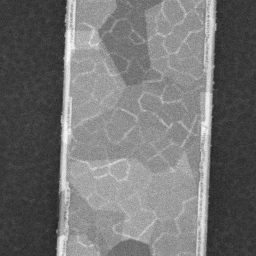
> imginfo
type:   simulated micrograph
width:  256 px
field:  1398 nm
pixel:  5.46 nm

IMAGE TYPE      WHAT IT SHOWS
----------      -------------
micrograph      one or a few lines or trenches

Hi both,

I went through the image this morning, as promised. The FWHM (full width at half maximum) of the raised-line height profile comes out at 767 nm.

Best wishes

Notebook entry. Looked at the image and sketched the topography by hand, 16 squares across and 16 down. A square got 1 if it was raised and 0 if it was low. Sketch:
0000111111111000
0000111111111000
0000111111111000
0000111111111000
0000111111111000
0000111111111000
0000111111111000
0000111111111000
0000111111111000
0000111111111000
0000111111111000
0000111111111000
0000111111111000
0000111111111000
0000111111111000
0000111111111000